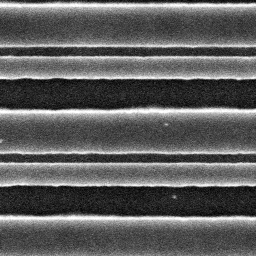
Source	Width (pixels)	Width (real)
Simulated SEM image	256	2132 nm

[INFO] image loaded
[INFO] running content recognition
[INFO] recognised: lines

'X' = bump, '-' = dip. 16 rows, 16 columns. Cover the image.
XXXXXXXXXXXXXXXX
XXXXXXXXXXXXXXXX
XXXXXXXXXXXXXXXX
XXXXXXXXXXXXXXXX
XXXXXXXXXXXXXXXX
----------------
----------------
XXXXXXXXXXXXXXXX
XXXXXXXXXXXXXXXX
XXXXXXXXXXXXXXXX
XXXXXXXXXXXXXXXX
XXXXXXXXXXXXXXXX
----------------
----------------
XXXXXXXXXXXXXXXX
XXXXXXXXXXXXXXXX